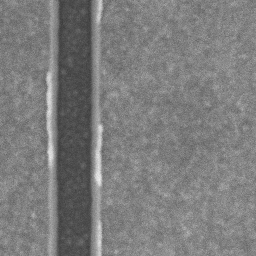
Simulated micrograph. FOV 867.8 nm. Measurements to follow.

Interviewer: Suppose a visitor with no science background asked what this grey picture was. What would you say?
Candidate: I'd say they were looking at one or a few lines or trenches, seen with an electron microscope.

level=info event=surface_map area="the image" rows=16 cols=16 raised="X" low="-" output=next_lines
XXX---XXXXXXXXXX
XXX---XXXXXXXXXX
XXX---XXXXXXXXXX
XXX---XXXXXXXXXX
XXX---XXXXXXXXXX
XXX---XXXXXXXXXX
XXX---XXXXXXXXXX
XXX---XXXXXXXXXX
XXX---XXXXXXXXXX
XXX---XXXXXXXXXX
XXX---XXXXXXXXXX
XXX---XXXXXXXXXX
XXX---XXXXXXXXXX
XXX---XXXXXXXXXX
XXX---XXXXXXXXXX
XXX---XXXXXXXXXX